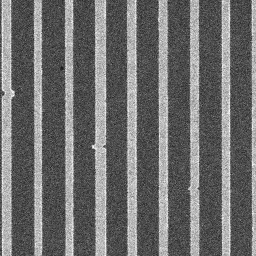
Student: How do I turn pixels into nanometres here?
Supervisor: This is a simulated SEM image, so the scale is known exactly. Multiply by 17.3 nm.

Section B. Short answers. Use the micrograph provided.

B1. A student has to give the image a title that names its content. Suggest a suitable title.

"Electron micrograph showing parallel lines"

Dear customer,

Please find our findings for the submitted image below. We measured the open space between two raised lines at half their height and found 399 nanometers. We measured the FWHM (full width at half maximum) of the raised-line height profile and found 139 nm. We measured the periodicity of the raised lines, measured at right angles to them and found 544 nm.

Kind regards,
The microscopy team